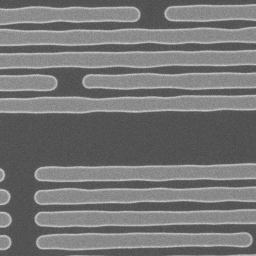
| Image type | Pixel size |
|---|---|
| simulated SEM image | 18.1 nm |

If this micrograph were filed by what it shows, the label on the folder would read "groups of lines, slits or small figures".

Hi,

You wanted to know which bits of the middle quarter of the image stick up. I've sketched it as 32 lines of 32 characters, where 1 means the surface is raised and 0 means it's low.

11111111111110011111111100000000
00000000000000000000000000000000
00000000000000000111111000000011
00000111111111111111111111111111
00000111111111111111111111111111
00000111111111111111111111111111
00000000000000000000000000000000
00000000000000000000000000000000
11111000000001111111111111111111
11111111111111111111111111111111
11111111111111111111111111111111
11111111111111111111111111111111
00000000000000000000000000000000
00000000000000000000000000000000
00000000000000000000000000000000
00000000000000000000000000000000
00000000000000000000000000000000
00000000000000000000000000000000
00000000000000000000000000000000
00000000000000000000000000000000
00000000000000000000000000000000
00000000000000000000000000000000
00000000000000000000000000000000
00000000000000000000000000000000
00000000000000000000000000000000
00000000000000000000000000001111
11111111111111111111111111111111
11111111111111111111111111111111
11111111111111111111111111111111
00000000000000000000000000000000
00000000000000000000000000000000
11111000111111111111111111111111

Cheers